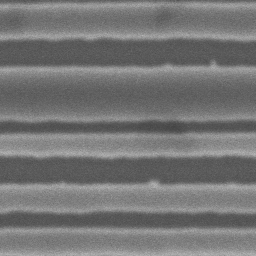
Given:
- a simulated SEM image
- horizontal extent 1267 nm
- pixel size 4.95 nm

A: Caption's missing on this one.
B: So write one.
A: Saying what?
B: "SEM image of lines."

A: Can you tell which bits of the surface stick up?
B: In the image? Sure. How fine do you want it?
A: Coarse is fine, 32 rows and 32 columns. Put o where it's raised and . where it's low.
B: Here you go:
........o...oooooooooooooooo..oo
oooooooooooooooooooooooooooooooo
oooooooooooooooooooooooooooooooo
oooooooooooooooooooooooooooooooo
oooooooooooooooooooooooooooooooo
................................
................................
................................
oooooooooooooooooo.ooooooooooooo
oooooooooooooooooooooooooooooooo
oooooooooooooooooooooooooooooooo
oooooooooooooooooooooooooooooooo
oooooooooooooooooooooooooooooooo
oooooooooooooooooooooooooooooooo
oooooooooooooooooooooooooooooooo
................................
................................
oooooooooooooooooooooooooooooooo
oooooooooooooooooooooooooooooooo
............oo..................
................................
................................
................................
oooooooooooooooooooooooooooooooo
oooooooooooooooooooooooooooooooo
oooooooooooooooooooooooooooooooo
o......oooo.............o..o.ooo
................................
................................
oooooooooooooooooooooooooooooooo
oooooooooooooooooooooooooooooooo
oooooooooooooooooooooooooooooooo